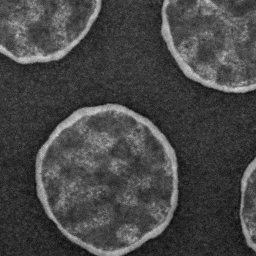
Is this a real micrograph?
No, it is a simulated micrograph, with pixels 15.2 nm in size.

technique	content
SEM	raised bodies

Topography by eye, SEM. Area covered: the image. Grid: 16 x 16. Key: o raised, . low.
oooooo....oooooo
oooooo....oooooo
ooooo......ooooo
.oo........ooooo
............oooo
..............oo
................
....ooooo.......
...ooooooo......
...oooooooo.....
..ooooooooo.....
..ooooooooo....o
...oooooooo....o
...oooooooo....o
....oooooo.....o
......oo........